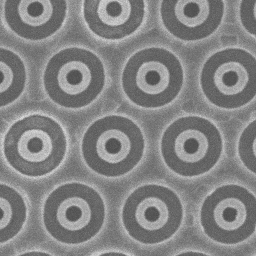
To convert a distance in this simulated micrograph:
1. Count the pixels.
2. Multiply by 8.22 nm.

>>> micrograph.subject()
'ring-shaped grooves with a dot in the middle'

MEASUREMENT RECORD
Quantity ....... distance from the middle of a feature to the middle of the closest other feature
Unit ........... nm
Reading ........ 641